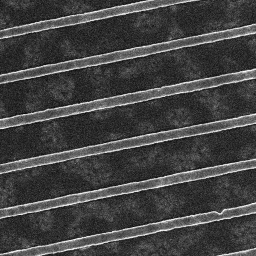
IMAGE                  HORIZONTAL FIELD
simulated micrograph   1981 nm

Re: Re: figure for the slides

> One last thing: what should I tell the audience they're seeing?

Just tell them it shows parallel lines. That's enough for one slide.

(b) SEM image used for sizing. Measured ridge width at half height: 70.2 nm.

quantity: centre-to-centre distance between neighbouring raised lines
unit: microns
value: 0.341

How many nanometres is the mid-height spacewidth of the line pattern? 271